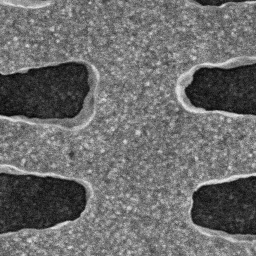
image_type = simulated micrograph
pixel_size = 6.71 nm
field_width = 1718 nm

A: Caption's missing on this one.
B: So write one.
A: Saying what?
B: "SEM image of holes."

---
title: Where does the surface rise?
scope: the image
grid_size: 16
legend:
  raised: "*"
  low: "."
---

****************
****************
****************
****************
*.....******....
......******....
......******....
**...***********
****************
****************
****************
.....********...
......******....
.....*******....
.************...
****************